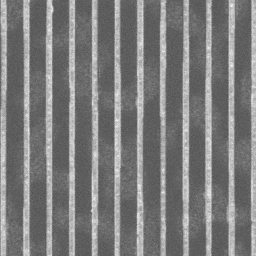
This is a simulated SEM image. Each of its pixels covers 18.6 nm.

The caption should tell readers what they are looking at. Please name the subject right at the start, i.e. parallel lines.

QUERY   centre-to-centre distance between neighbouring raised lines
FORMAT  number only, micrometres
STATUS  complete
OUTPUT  0.425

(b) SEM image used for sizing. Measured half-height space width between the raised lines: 339 nm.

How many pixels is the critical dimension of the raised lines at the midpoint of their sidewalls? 4.37